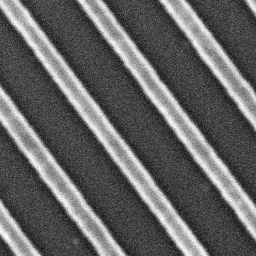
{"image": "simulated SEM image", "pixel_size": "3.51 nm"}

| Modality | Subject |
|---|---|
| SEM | lines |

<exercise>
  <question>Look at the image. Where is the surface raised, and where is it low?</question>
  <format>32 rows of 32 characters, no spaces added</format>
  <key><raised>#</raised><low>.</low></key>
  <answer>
##........###........##........#
.##........###.......###........
.###........##........###.......
..###.......###........###......
...###.......###........##......
....##........###.......###.....
.....##........##........###....
.....###........##........###...
......###.......###........##...
.......##........##........###..
.......###........##........###.
........###.......###........###
#........##........###........##
##........##........##........##
###.......###........##........#
.##........###.......###........
.###........##........###.......
..###........##........##.......
...###.......###........##......
....##........###.......###.....
....###........##........###....
.....###........##........###...
......###.......###........##...
......###........###.......###..
.......###........##........###.
........###........##........##.
#........###.......###........##
##........##........###.......##
##........###........##........#
###........###........##........
.###........##........###.......
..###.......###........###......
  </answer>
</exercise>